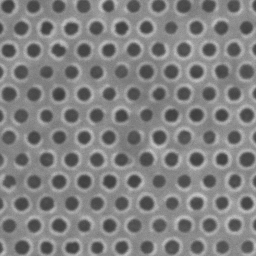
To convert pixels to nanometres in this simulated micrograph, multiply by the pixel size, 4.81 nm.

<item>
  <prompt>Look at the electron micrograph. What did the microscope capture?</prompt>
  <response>a regular array of holes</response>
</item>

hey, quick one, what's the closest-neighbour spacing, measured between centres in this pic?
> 119 nanometres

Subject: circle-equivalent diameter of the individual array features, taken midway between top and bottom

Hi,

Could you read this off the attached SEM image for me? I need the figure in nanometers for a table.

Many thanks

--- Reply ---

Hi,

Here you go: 68.2